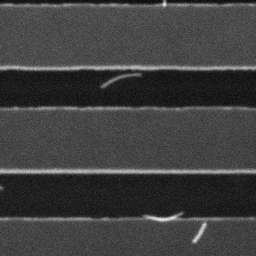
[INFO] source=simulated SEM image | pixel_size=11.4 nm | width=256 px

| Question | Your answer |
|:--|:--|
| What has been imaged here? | lines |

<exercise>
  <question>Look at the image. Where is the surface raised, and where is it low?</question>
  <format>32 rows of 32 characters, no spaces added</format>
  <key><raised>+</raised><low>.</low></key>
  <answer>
....................+...........
++++++++++++++++++++++++++++++++
++++++++++++++++++++++++++++++++
++++++++++++++++++++++++++++++++
++++++++++++++++++++++++++++++++
++++++++++++++++++++++++++++++++
++++++++++++++++++++++++++++++++
++++++++++++++++++++++++++++++++
++++++++++++++++++++++++++++++++
................................
................................
................................
................................
.+++++++++++++++++++...++++++++.
++++++++++++++++++++++++++++++++
++++++++++++++++++++++++++++++++
++++++++++++++++++++++++++++++++
++++++++++++++++++++++++++++++++
++++++++++++++++++++++++++++++++
++++++++++++++++++++++++++++++++
++++++++++++++++++++++++++++++++
++++++++++++++++++++++++.++++...
................................
................................
................................
................................
................................
++++++++++++++++++++++++++++++++
++++++++++++++++++++++++++++++++
++++++++++++++++++++++++++++++++
++++++++++++++++++++++++++++++++
++++++++++++++++++++++++++++++++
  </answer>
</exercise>